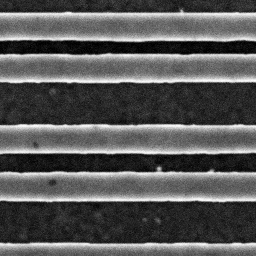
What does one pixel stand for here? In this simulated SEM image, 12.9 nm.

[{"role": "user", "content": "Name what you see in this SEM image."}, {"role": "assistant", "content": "lines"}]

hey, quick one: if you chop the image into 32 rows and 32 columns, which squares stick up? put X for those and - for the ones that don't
--------------------------------
--------------------------------
XXXXXXXXXXXXXXXXXXXXXXXXXXXXXXXX
XXXXXXXXXXXXXXXXXXXXXXXXXXXXXXXX
XXXXXXXXXXXXXXXXXXXXXXXXXXXXXXXX
--------------------------------
--------------------------------
XXXXXXXXXXXXXXXXXXXXXXXXXXXXXXXX
XXXXXXXXXXXXXXXXXXXXXXXXXXXXXXXX
XXXXXXXXXXXXXXXXXXXXXXXXXXXXXXXX
--------------------------------
--------------------------------
--------------------------------
--------------------------------
--------------------------------
--------------------------------
XXXXXXXXXXXXXXXXXXXXXXXXXXXXXXXX
XXXXXXXXXXXXXXXXXXXXXXXXXXXXXXXX
XXXXXXXXXXXXXXXXXXXXXXXXXXXXXXXX
--------------------------------
--------------------------------
--------------------------------
XXXXXXXXXXXXXXXXXXXXXXXXXXXXXXXX
XXXXXXXXXXXXXXXXXXXXXXXXXXXXXXXX
XXXXXXXXXXXXXXXXXXXXXXXXXXXXXXXX
--------------------------------
--------------------------------
--------------------------------
--------------------------------
--------------------------------
X--XXXXXXXX-------XX-XXXXX---XXX
XXXXXXXXXXXXXXXXXXXXXXXXXXXXXXXX